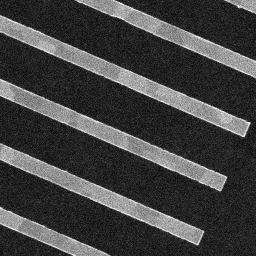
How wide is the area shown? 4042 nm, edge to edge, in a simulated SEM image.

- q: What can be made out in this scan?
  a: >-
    parallel lines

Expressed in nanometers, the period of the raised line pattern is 926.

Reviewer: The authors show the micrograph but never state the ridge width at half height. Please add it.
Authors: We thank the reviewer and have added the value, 243 nm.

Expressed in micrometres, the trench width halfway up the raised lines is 0.682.